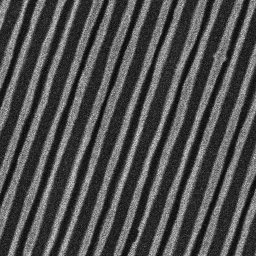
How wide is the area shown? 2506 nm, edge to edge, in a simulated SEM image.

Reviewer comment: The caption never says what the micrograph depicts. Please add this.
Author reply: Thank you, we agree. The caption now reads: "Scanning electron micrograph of parallel lines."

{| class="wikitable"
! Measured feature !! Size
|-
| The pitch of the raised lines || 164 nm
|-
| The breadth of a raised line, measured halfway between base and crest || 63.7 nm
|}